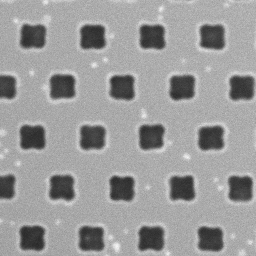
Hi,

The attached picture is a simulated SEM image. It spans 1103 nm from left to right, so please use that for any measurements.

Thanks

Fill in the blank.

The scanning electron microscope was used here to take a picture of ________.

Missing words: a regular array of holes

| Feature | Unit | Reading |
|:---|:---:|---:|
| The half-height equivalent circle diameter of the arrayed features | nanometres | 121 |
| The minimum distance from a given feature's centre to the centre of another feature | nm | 251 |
